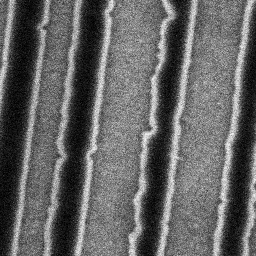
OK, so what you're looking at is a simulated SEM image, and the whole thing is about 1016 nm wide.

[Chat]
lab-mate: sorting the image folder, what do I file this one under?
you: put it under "one or a few lines or trenches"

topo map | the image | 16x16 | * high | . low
.**..**...**...*
***..**...**...*
***..**...**...*
***.***...**...*
**..**....**...*
**..**....*....*
**..**....*....*
**..**...**....*
**..**...**...**
**..**...**...**
**..**...**...**
*..***...**...**
*..**....**...**
*..**....*....**
*..**...**....**
*..**...**...**.